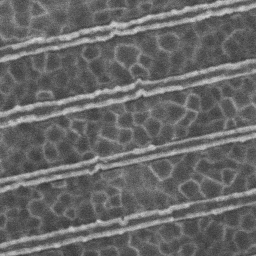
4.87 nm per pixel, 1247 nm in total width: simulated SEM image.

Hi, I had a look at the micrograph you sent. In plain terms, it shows one or a few lines or trenches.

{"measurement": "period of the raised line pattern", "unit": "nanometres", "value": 311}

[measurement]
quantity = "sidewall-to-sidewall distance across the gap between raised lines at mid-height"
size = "0.244 µm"